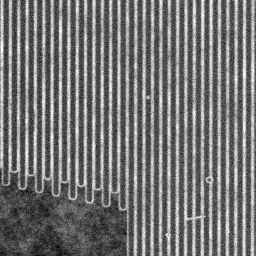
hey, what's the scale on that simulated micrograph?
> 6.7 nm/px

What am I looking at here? parallel lines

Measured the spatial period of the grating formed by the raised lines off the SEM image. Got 56 nanometres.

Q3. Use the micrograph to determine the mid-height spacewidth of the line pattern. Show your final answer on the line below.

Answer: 0.0435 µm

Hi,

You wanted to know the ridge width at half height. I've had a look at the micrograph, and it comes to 12.6 nm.